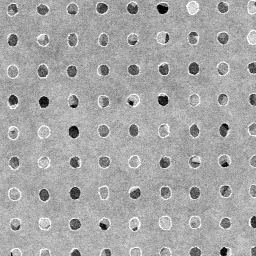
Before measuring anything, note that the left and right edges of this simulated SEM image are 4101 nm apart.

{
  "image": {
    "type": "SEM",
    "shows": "a regular array of raised bodies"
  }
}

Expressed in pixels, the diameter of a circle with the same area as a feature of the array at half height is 12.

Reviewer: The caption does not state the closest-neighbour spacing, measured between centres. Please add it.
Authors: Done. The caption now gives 474 nanometres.